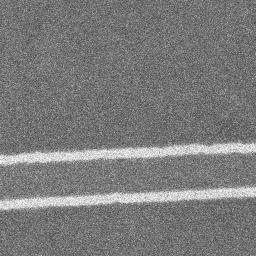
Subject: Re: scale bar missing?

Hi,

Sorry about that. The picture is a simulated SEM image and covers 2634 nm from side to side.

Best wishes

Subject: one or a few lines or trenches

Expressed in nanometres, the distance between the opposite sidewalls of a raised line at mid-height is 475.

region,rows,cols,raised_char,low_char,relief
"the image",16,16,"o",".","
................
................
................
................
................
................
................
................
................
.........ooooooo
oooooooooooooooo
oooooooooooooooo
oooooo..........
................
................
................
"